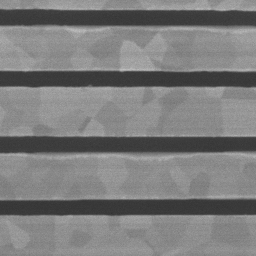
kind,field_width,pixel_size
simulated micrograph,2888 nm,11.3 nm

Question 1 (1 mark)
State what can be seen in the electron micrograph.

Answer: lines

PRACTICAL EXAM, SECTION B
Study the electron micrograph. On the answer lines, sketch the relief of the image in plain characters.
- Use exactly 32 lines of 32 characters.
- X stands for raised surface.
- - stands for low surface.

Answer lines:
XXXXXXXXXXXXXXXXXXXXXXXXXXXXXXXX
--------------------------------
--------------------------------
XXXXXXXXXXXXXXXXXXXXXXXXXXXX----
XXXXXXXXXXXXXXXXXXXXXXXXXXXXXXXX
XXXXXXXXXXXXXXXXXXXXXXXXXXXXXXXX
XXXXXXXXXXXXXXXXXXXXXXXXXXXXXXXX
XXXXXXXXXXXXXXXXXXXXXXXXXXXXXXXX
XXXXXXXXXXXXXXXXXXXXXXXXXXXXXXXX
--------------------------------
--------------------------------
XXXXXXXXXXXXXXXXXXXXXXXXXXXXXXXX
XXXXXXXXXXXXXXXXXXXXXXXXXXXXXXXX
XXXXXXXXXXXXXXXXXXXXXXXXXXXXXXXX
XXXXXXXXXXXXXXXXXXXXXXXXXXXXXXXX
XXXXXXXXXXXXXXXXXXXXXXXXXXXXXXXX
XXXXXXXXXXXXXXXXXXXXXXXXXXXXXXXX
--------------------------------
--------------------------------
XXXXXXXXXXXXXXXXXXXXXXXXXXXXXXXX
XXXXXXXXXXXXXXXXXXXXXXXXXXXXXXXX
XXXXXXXXXXXXXXXXXXXXXXXXXXXXXXXX
XXXXXXXXXXXXXXXXXXXXXXXXXXXXXXXX
XXXXXXXXXXXXXXXXXXXXXXXXXXXXXXXX
XXXXXXXXXXXXXXXXXXXXXXXXXXXXXXXX
--------------------------------
--------------------------------
XXXXXXXXXXXXXXXXXXXXXXXXXXXXXXXX
XXXXXXXXXXXXXXXXXXXXXXXXXXXXXXXX
XXXXXXXXXXXXXXXXXXXXXXXXXXXXXXXX
XXXXXXXXXXXXXXXXXXXXXXXXXXXXXXXX
XXXXXXXXXXXXXXXXXXXXXXXXXXXXXXXX